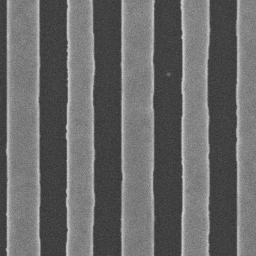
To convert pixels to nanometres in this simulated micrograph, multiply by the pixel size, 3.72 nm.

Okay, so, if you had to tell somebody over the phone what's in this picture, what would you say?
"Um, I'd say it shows lines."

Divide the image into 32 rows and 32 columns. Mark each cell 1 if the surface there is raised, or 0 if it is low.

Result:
01111000111100011110000111000011
01111000111100011110000111000011
01111000111100011110000111000011
01111000111100011110000111000011
01111000111100011110000111000011
01111000111100011110000111000011
01111000111100011110000111000011
01111000111100011110000111000011
01111000111100011110000111000011
01111000111100011110000111000011
01111000011100011110000111000011
01111000011100011110000111000011
01111000011100011110000111000011
01111000111100011110000111000011
01111000111100011110000111000011
01111000111100011110000111000011
01111000111100011110000111000011
01111000111100011110000111000011
01111000111100011110000111000011
01111000111100011110000111000011
01111000111100011110000111000011
01111000111100011110000111000011
01111000111100011110000111000011
01111000111100011110000111000011
01111000111100011110000111000011
01111000111100011110000111000011
01111000111100011110000111000011
01111000111100011110000111000011
01111000111100011110000111000011
01111000111100011110000111000011
01111000111100011110000111000011
01111000111100011110000111000011